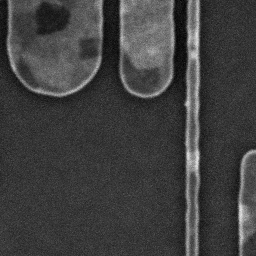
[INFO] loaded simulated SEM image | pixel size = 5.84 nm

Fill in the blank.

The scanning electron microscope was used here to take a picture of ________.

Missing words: groups of lines, slits or small figures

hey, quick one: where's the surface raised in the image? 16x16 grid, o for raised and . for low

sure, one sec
.ooooo..ooo.....
.ooooo..ooo.....
.ooooo..ooo.....
.ooooo..ooo.....
.ooooo..ooo.....
..ooo...oo......
................
................
................
................
...............o
...............o
...............o
...............o
...............o
...............o